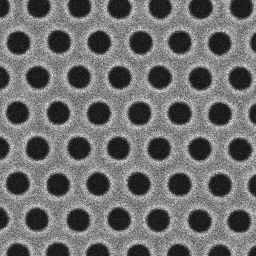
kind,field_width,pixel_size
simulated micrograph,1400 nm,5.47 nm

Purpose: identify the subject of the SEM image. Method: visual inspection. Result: a regular array of holes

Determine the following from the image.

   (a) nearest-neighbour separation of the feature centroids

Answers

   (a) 219 nm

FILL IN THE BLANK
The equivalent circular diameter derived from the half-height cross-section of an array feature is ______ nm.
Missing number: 130